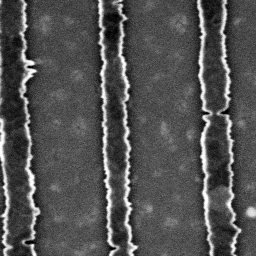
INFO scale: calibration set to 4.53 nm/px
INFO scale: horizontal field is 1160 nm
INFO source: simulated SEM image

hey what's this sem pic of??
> one or a few lines or trenches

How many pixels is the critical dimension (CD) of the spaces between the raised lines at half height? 76.1